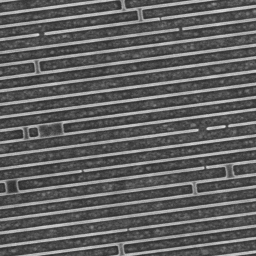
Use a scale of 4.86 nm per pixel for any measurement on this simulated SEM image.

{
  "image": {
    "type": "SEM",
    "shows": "parallel lines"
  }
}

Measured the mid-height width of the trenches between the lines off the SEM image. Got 53 nanometers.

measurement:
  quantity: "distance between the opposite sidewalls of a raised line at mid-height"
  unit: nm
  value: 13.2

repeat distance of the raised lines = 62.1 nanometres